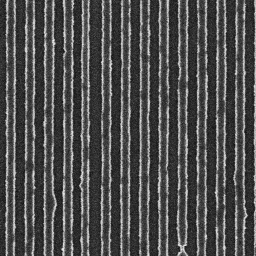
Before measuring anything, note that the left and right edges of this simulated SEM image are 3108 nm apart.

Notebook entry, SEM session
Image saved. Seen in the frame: parallel lines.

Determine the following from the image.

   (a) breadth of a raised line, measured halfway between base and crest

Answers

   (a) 0.111 um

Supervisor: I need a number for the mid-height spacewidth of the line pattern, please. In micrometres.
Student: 0.118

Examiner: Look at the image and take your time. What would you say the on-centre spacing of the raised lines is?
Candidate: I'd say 232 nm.